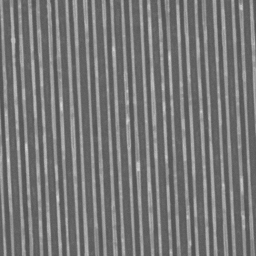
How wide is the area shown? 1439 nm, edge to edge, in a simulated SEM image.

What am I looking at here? parallel lines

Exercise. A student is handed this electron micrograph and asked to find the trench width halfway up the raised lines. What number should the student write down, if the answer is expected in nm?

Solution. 35.1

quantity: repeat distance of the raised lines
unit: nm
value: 51.8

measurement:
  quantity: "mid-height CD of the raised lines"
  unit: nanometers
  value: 14.7